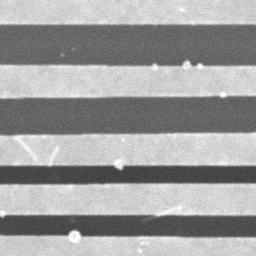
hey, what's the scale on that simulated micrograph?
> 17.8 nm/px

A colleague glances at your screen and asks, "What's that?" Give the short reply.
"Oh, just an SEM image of lines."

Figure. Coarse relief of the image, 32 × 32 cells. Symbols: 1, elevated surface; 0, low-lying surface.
11111111111111111111111111111111
11111111111111111111111111111111
11111111111111111111111111111111
00000000000000000000000000000000
00000000000000000000000000000000
00000000000000000000000000000000
00000000000000000000000000000000
00000000000000000000000000000000
11111111111111111111111111111111
11111111111111111111111111111111
11111111111111111111111111111111
11111111111111111111111111111111
00000000000000000000000000000000
00000000000000000000000000000000
00000000000000000000000000000000
00000000000000000000000000000000
00000000000000000000000000000000
11111111111111111111111111111111
11111111111111111111111111111111
11111111111111111111111111111111
11111111111111111111111111111111
00000000000000000000000000000000
00000000000000000000000000000000
11111111111111111111111111111111
11111111111111111111111111111111
11111111111111111111111111111111
11111111111111111111111111111111
00000000000000000000000000000000
00000000000000000000000000000000
10000000110000000000000000000000
11111111111111111111111111111111
11111111111111111111111111111111